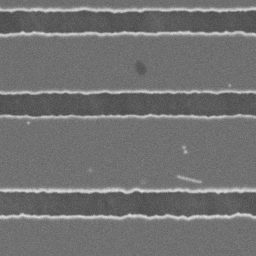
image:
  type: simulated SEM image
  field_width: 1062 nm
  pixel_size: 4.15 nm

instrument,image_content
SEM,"lines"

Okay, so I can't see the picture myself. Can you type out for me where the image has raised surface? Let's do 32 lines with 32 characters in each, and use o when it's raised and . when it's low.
oooooooooooooooooooooooooooooooo
................................
................................
................................
oooooooooooooooooooooooooooooooo
oooooooooooooooooooooooooooooooo
oooooooooooooooooooooooooooooooo
oooooooooooooooooooooooooooooooo
oooooooooooooooooooooooooooooooo
oooooooooooooooooooooooooooooooo
oooooooooooooooooooooooooooooooo
oooooooooooooooooooooooooooooooo
................................
................................
oo......oo..oooooooooooo....oooo
oooooooooooooooooooooooooooooooo
oooooooooooooooooooooooooooooooo
oooooooooooooooooooooooooooooooo
oooooooooooooooooooooooooooooooo
oooooooooooooooooooooooooooooooo
oooooooooooooooooooooooooooooooo
oooooooooooooooooooooooooooooooo
oooooooooooooooooooooooooooooooo
oooooooooooooooooooooooooooooooo
................................
................................
................................
oooooooooooooooooooooooooooooooo
oooooooooooooooooooooooooooooooo
oooooooooooooooooooooooooooooooo
oooooooooooooooooooooooooooooooo
oooooooooooooooooooooooooooooooo